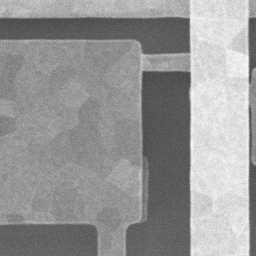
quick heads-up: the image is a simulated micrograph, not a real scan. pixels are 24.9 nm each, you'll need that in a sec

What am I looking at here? wiring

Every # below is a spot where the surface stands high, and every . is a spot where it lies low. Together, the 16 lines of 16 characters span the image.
............###.
............###.
.#####.#....###.
#########...###.
#########...###.
#########...###.
#########...###.
#########...####
#########...####
#########...####
#########...####
#########...###.
#########...####
#########...####
......##....####
......##....####